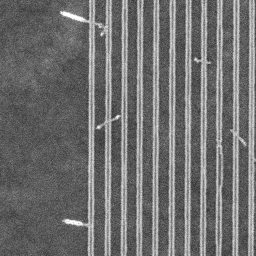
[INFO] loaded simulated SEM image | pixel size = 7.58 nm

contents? parallel lines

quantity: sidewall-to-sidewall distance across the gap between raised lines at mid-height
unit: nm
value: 94.7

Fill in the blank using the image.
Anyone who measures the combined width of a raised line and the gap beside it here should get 16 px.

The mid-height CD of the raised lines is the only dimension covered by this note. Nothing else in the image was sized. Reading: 29.4 nanometres